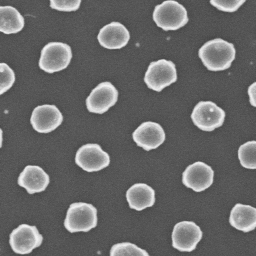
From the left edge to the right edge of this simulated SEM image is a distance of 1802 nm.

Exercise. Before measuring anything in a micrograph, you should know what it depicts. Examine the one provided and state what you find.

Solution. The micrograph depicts a regular array of raised bodies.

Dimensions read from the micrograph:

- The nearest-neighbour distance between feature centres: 0.425 microns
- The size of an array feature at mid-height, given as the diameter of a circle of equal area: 200 nm